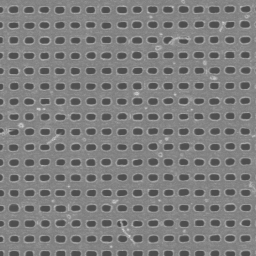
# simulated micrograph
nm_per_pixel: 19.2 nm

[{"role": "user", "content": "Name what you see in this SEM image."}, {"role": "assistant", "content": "a regular array of holes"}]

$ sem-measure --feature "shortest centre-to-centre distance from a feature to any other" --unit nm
286